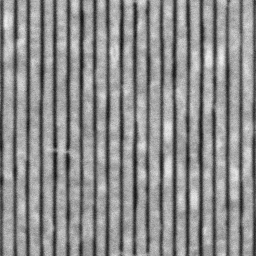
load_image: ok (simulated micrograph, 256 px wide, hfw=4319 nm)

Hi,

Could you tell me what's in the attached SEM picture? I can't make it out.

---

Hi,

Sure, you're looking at parallel lines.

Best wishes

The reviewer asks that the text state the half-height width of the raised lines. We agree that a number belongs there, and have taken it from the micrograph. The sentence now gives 164 nm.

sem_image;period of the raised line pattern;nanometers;225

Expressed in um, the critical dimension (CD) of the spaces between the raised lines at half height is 0.0654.